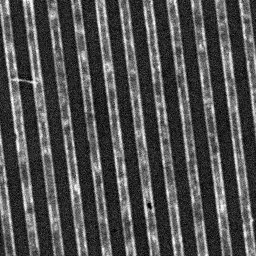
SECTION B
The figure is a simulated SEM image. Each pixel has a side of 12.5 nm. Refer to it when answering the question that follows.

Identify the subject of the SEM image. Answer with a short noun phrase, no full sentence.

parallel lines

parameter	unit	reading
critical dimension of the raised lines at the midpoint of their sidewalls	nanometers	117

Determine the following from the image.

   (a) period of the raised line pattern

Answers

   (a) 23.9 px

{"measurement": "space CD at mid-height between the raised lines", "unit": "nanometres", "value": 190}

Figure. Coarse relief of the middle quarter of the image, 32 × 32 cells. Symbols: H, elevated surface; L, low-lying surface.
LLLLHHLLLLHHLLLLHHLLLLHHLLLLHHLL
LLLLHHLLLLHHLLLLHHLLLLHHLLLLHHLL
LLLLHHLLLLHHLLLLHHLLLLHHLLLLHHLL
LLLLHHLLLLHHLLLLHHLLLLHHLLLLHHLL
LLLLHHLLLLHHHLLLHHLLLLHHHLLLHHLL
HLLLLHHLLLLHHLLLLHHLLLHHHLLLHHHL
HLLLLHHLLLLHHLLLLHHLLLLHHLLLLHHL
HLLLLHHLLLLHHLLLLHHLLLLHHLLLLHHL
HLLLLHHLLLLHHLLLLHHLLLLHHLLLLHHL
HLLLLHHLLLLHHLLLLHHLLLLHHLLLLHHL
HLLLLHHLLLLHHLLLLHHLLLLHHLLLLHHL
HLLLLHHLLLLHHLLLLHHLLLLHHLLLLHHL
HLLLLHHLLLLHHHLLLHHLLLLHHHLLLHHL
HHLLLLHHLLLLHHLLLHHLLLLHHHLLLHHH
HHLLLLHHLLLLHHLLLLHHLLLLHHLLLLHH
HHLLLLHHLLLLHHLLLLHHLLLLHHLLLLHH
HHLLLLHHLLLLHHLLLLHHLLLLHHLLLLHH
HHLLLLHHLLLLHHLLLLHHLLLLHHLLLLHH
HHLLLLHHLLLLHHLLLLHHLLLLHHLLLLHH
HHLLLLLHLLLLHHLLLLHHLLLLHHLLLLHH
HHLLLLLHLLLLHHHLLLHHLLLLHHHLLLHH
LHHLLLLHHLLLLHHLLLHHLLLLHHHLLLHH
LHHLLLLHHLLLLHHLLLLHHLLLLHHLLLLH
LHHLLLLHHLLLLHHLLLLHHLLLLHHLLLLH
LHHLLLLHHLLLLHHLLLLHHLLLLHHLLLLH
LHHLLLLHHLLLLHHLLLLHHLLLLHHLLLLH
LHHLLLLHHLLLLHHLLLLHHLLLLHHLLLLH
LHHLLLLHHLLLLHHLLLLHHLLLLHHLLLLH
LHHLLLLHHLLLLHHHLLLHHLLLLHHLLLLH
LLHHLLLLHHLLLLHHLLLHHLLLLHHHLLLH
LLHHLLLLHHLLLLHHLLLLHHLLLLHHLLLL
LLHHLLLLHHLLLLHHLLLLHHLLLLHHLLLL